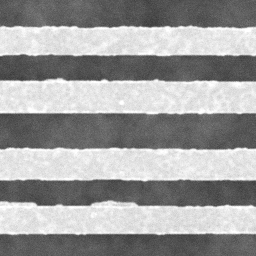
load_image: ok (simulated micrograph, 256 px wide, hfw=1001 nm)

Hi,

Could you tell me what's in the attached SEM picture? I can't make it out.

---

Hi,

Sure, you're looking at lines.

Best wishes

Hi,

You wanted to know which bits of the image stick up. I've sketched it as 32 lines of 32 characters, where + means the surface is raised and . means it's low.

................................
................................
................................
++++++++++.++++++++++++++++++..+
++++++++++++++++++++++++++++++++
++++++++++++++++++++++++++++++++
++++++++++++++++++++++++++++++++
................................
................................
................................
++++++++++++++++++++++++++++++++
++++++++++++++++++++++++++++++++
++++++++++++++++++++++++++++++++
++++++++++++++++++++++++++++++++
................................
................................
................................
................................
................................
++++++++++++++++++++++++++++++++
++++++++++++++++++++++++++++++++
++++++++++++++++++++++++++++++++
.................++.............
................................
................................
................................
++++++++++++++++++++++++++++++++
++++++++++++++++++++++++++++++++
++++++++++++++++++++++++++++++++
................................
................................
................................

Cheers